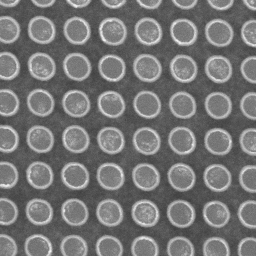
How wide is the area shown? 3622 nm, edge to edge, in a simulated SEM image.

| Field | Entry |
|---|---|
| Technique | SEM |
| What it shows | a regular array of raised bodies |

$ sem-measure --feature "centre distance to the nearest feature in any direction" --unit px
35.3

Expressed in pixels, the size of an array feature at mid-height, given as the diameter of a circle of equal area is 25.8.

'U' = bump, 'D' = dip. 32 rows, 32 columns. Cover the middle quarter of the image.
UUUUUUDDDUUUUUUDDDUUUUUUDDDUUUUU
UUUUUUDDDUUUUUUDDDUUUUUUDDDUUUUU
DUUUUUDDDUUUUUUDDDUUUUUUDDDUUUUU
DDUUUDDDDDUUUUDDDDDUUUUDDDDDUUUU
DDDDDDDDDDDDDDDDDDDDDDDDDDDDDDDD
DDDDDDDDDDDDDDDDDDDDDDDDDDDDDDDD
DDDDDDDDDDDDDDDDDDDDDDDDDDDDDDDD
DUUUUDDDDDUUUDDDDDDUUUDDDDDDUUUD
UUUUUUDDDUUUUUDDDDUUUUUDDDDUUUUU
UUUUUUDDDUUUUUUDDDUUUUUUDDDUUUUU
UUUUUUDDDUUUUUUDDDUUUUUUDDDUUUUU
DUUUUUDDDUUUUUUDDDUUUUUUDDDUUUUU
DUUUUDDDDDUUUUDDDDDUUUUDDDDDUUUU
DDDDDDDDDDDDDDDDDDDDDDDDDDDDDDDD
DDDDDDDDDDDDDDDDDDDDDDDDDDDDDDDD
DDDDDDDDDDDDDDDDDDDDDDDDDDDDDDDD
DUUUUDDDDDUUUDDDDDDUUUDDDDDUUUUD
UUUUUUDDDUUUUUDDDDUUUUUDDDDUUUUU
UUUUUUDDDUUUUUUDDDUUUUUUDDUUUUUU
UUUUUUDDDUUUUUUDDDUUUUUUDDUUUUUU
UUUUUUDDDUUUUUUDDDUUUUUUDDDUUUUU
DDUUUDDDDDUUUUDDDDDUUUUDDDDDUUUU
DDDDDDDDDDDDDDDDDDDDDDDDDDDDDDDD
DDDDDDDDDDDDDDDDDDDDDDDDDDDDDDDD
DDDDDDDDDDDDDDDDDDDDDDDDDDDDDDDD
DUUUUDDDDUUUUDDDDDDUUUDDDDDDUUUD
UUUUUDDDDUUUUUDDDDUUUUUDDDDUUUUU
UUUUUUDDUUUUUUUDDUUUUUUDDDUUUUUU
UUUUUUDDUUUUUUUDDUUUUUUUDDUUUUUU
UUUUUUDDDUUUUUUDDDUUUUUDDDDUUUUU
DUUUUDDDDDUUUUDDDDUUUUUDDDDUUUUU
DDDDDDDDDDDDDDDDDDDDDDDDDDDDDDDD